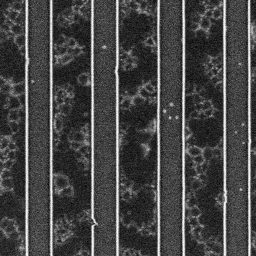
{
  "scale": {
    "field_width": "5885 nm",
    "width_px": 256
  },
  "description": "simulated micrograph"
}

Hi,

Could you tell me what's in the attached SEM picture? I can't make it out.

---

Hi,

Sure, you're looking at one or a few lines or trenches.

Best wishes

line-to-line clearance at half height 24.5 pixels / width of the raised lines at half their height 951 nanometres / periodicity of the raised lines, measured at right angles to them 1520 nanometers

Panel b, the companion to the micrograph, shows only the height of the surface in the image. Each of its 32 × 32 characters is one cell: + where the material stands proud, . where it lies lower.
+++...++++++...+++++...+++++...+
+++...++++++...+++++...+++++...+
+++...++++++...+++++...+++++...+
+++...++++++...+++++...+++++...+
+++...++++++...+++++...+++++...+
+++...++++++...+++++...+++++...+
+++...++++++...+++++...+++++...+
+++...++++++...+++++...+++++...+
+++...++++++...+++++...+++++...+
+++...++++++...+++++...+++++...+
+++...++++++...+++++...+++++...+
+++...++++++...+++++...+++++...+
+++...++++++...+++++...+++++...+
+++...++++++...+++++...+++++...+
+++...++++++...+++++...+++++...+
+++...++++++...+++++...+++++...+
+++...++++++...+++++...+++++...+
+++...++++++...+++++...+++++...+
+++...++++++...+++++...+++++...+
+++...++++++...+++++...+++++...+
+++...++++++...+++++...+++++...+
+++...++++++...+++++...+++++...+
+++...++++++...+++++...+++++...+
+++...++++++...+++++...+++++...+
+++...++++++...+++++...+++++...+
+++...++++++...+++++...+++++...+
+++...++++++...+++++...+++++...+
+++...++++++...+++++...+++++...+
+++...++++++...+++++...+++++...+
+++...++++++...+++++...+++++...+
+++...++++++...+++++...+++++...+
+++...++++++...+++++...+++++...+